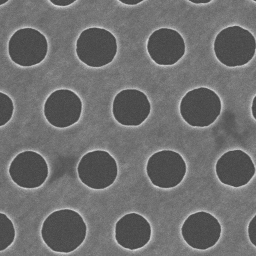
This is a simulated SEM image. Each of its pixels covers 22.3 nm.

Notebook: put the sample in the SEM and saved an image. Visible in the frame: a regular array of holes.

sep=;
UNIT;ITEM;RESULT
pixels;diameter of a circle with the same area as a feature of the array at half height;38.3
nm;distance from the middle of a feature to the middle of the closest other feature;1530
